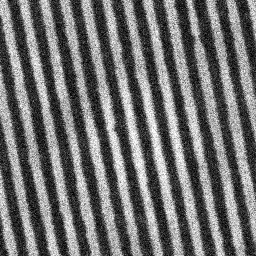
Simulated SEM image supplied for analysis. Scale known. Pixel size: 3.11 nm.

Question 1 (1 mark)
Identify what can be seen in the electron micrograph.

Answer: parallel lines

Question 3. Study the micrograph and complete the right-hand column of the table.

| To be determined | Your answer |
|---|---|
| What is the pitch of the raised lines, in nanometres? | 63.2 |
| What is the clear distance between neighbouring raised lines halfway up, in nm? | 38.1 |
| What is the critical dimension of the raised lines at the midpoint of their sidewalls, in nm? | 24.4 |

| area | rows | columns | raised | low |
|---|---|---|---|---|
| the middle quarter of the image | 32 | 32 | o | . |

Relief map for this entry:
...o....oo...oo...oo...oo...oo..
...oo...oo...oo...oo...oo...ooo.
...oo...oo...oo...oo....oo...oo.
...oo...oo...oo...ooo...oo...oo.
...oo....oo...oo...oo...oo...oo.
...oo....oo...oo...oo...oo...ooo
....o....oo...oo...oo....oo...oo
o...oo...oo...oo....oo...oo...oo
o...oo...oo...ooo...oo...oo...oo
o...oo...ooo...oo...oo...oo...oo
o...oo....oo...oo...oo...oo...oo
oo...oo...oo...oo...oo...ooo..oo
oo...oo...oo...ooo...o....oo...o
oo...oo...oo....oo...oo...oo...o
oo...oo....oo...oo...oo...oo...o
oo....oo...o....oo...oo...oo...o
.o....oo...o....oo...oo...oo....
.oo...oo...oo...oo....oo...oo...
.oo...oo...oo...ooo...oo...oo...
.oo...ooo...oo...oo...oo...oo...
..o....oo...oo...oo...oo...oo...
..oo...oo...oo...oo...oo...ooo..
..oo...oo...oo...oo...ooo...oo..
..oo...oo...oo...ooo..ooo...oo..
...o...ooo...oo...oo...oo...oo..
...o....oo...oo...oo...oo...oo..
...o....oo...oo...oo...ooo...oo.
...oo...oo...oo...oo....oo...oo.
...oo...oo...oo....oo...oo...oo.
...oo....oo...oo...oo...oo...oo.
...oo....oo...oo...oo...oo...oo.
....oo...oo...oo...oo...ooo...oo